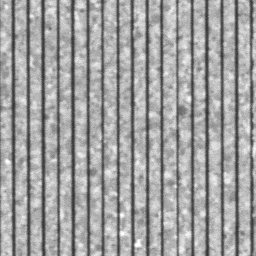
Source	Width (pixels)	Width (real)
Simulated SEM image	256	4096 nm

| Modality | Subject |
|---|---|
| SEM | parallel lines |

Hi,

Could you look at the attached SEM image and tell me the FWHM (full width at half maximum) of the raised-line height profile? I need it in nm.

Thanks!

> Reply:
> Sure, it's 174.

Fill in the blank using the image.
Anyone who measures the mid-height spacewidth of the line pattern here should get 0.064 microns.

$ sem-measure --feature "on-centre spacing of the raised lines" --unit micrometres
0.238